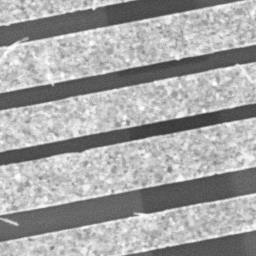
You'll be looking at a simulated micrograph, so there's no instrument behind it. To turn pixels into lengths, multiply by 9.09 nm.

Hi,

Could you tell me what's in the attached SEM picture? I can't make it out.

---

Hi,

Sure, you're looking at one or a few lines or trenches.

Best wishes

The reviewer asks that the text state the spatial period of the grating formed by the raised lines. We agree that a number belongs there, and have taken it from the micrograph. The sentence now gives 0.555 micrometres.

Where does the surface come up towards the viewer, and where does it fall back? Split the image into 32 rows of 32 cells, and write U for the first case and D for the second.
UUUUUUUUUUUUUUDDDDDDDDDDDDDDDUUU
UUUUUUUUDDDDDDDDDDDDDDDUUUUUUUUU
UUUDDDDDDDDDDDDDDDUUUUUUUUUUUUUU
DDDDDDDDDDDDDUUUUUUUUUUUUUUUUUUU
DDDDDDDDUUUUUUUUUUUUUUUUUUUUUUUU
DDDUUUUUUUUUUUUUUUUUUUUUUUUUUUUU
UUUUUUUUUUUUUUUUUUUUUUUUUUDDDDDD
UUUUUUUUUUUUUUUUUUUUUDDDDDDDDDDD
UUUUUUUUUUUUUUUUDDDDDDDDDDDDUUUU
UUUUUUUUUUUDDDDDDDDDDDDUUUUUUUUU
UUUUUUDDDDDDDDDDDDUUUUUUUUUUUUUU
DDDDDDDDDDDDDUUUUUUUUUUUUUUUUUUU
DDDDDDDDUUUUUUUUUUUUUUUUUUUUUUUU
DDDUUUUUUUUUUUUUUUUUUUUUUUUUDDDD
UUUUUUUUUUUUUUUUUUUUUUUDDDDDDDDD
UUUUUUUUUUUUUUUUUUDDDDDDDDDDUUUU
UUUUUUUUUUUUDDDDDDDDDDUUUUUUUUUU
UUUUUUUDDDDDDDDDDUUUUUUUUUUUUUUU
UUDDDDDDDDDDUUUUUUUUUUUUUUUUUUUU
DDDDDDDUUUUUUUUUUUUUUUUUUUUUUUUU
DDUUUUUUUUUUUUUUUUUUUUUUUUUUUUUU
UUUUUUUUUUUUUUUUUUUUUUUUUUUUDDDD
UUUUUUUUUUUUUUUUUUUUUUUDDDDDDDDD
UUUUUUUUUUUUUUUUUUDDDDDDDDDDDDDD
UUUUUUUUUUUUUDDDDDDDDDDDDDDDDDUU
UUUUUUUDDDDDDDDDDDDDDDDDDDUUUUUU
UUDDDDDDDDDDDDDDDDDDUUUUUUUUUUUU
DDDDDDDDDDDDDDDUUUUUUUUUUUUUUUUU
DDDDDDDDDDUUUUUUUUUUUUUUUUUUUUUU
DDDDDUUUUUUUUUUUUUUUUUUUUUUDDDDD
UUUUUUUUUUUUUUUUUUUUUUDDDDDDDDDD
UUUUUUUUUUUUUUUUUDDDDDDDDDDDDDDD